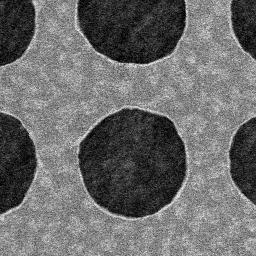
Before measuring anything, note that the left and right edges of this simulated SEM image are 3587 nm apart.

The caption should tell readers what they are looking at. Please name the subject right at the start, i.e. holes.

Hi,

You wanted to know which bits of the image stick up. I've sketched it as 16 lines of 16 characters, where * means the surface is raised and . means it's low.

..***.......**..
..***.......**..
..***......****.
.******....*****
****************
****************
****************
.*****.....*****
..***......****.
..***.......**..
..***.......**..
..***......****.
.*****.....*****
*******..*******
****************
****************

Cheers